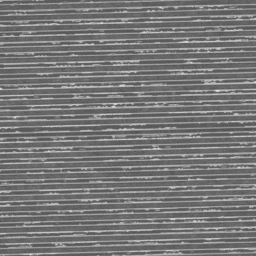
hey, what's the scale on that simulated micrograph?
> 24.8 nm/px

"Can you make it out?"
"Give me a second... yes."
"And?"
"parallel lines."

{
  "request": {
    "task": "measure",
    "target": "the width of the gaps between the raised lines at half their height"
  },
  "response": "0.152 micrometres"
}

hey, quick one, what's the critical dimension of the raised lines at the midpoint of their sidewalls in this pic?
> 130 nm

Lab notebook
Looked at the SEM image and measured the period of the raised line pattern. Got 0.263 microns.